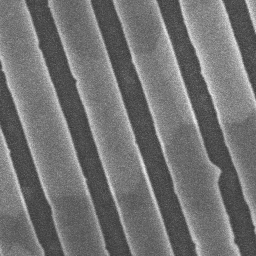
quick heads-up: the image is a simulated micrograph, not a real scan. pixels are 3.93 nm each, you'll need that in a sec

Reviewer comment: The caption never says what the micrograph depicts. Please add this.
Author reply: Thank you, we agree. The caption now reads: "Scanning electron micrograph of one or a few lines or trenches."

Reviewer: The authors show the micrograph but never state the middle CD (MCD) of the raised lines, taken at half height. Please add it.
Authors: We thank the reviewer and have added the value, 161 nanometres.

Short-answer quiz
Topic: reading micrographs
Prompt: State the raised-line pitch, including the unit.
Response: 246 nm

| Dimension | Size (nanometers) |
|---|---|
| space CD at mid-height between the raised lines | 85.8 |